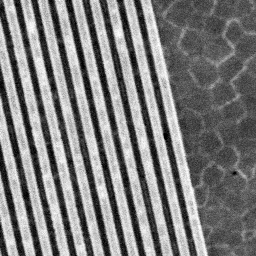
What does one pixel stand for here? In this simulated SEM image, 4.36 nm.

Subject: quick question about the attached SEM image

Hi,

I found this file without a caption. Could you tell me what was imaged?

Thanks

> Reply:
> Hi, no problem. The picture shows parallel lines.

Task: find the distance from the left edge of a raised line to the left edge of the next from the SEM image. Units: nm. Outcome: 73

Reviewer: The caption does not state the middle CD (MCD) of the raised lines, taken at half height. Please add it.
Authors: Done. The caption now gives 0.0333 µm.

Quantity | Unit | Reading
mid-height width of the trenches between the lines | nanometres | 37.8